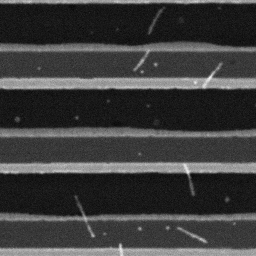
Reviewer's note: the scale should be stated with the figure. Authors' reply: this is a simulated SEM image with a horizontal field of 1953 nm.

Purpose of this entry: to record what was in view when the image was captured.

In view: lines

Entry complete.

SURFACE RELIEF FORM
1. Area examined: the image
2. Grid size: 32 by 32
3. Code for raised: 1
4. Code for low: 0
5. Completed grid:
00000000000000000000000000000000
00000000000000000000000000000000
00000000000000000000000000000000
00000000000000000000000000000000
00000000000000000000000000000000
00000000000000000000000000000000
11111111111111111111111111111111
11111111111111111111111111111111
11111111111111111111111111111111
11111111111111111111111111111111
11111111111111111111111111111111
00000000000000000000000000000000
00000000000000000000000000000000
00000000000000000000000000000000
00000000000000000000000000000000
00000000000000000000000000000000
00000000000000000000000000000000
11111111111111111111111111111111
11111111111111111111111111111111
11111111111111111111111111111111
11111111111111111111111111111111
11111110111110011000111111100111
00000000000000000000000000000000
00000000000000000000000000000000
00000000000000000000000000000000
00000000000000000000000000000000
00000000000000000000000000000000
11111111111111111111111111111111
11111111111111111111111111111111
11111111111111111111111111111111
11111111111111111111111111111111
11111111111111111111111111111111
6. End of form